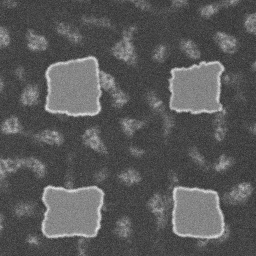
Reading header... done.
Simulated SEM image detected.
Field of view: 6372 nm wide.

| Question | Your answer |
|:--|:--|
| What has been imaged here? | raised bodies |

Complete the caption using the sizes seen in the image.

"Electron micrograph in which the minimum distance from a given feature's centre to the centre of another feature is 3070 nm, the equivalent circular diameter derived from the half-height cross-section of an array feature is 1.38 micrometres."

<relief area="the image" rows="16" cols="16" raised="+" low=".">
................
................
................
................
...+++.....+++..
...+++.....+++..
...+++.....+++..
................
................
................
................
................
...+++.....+++..
...+++.....+++..
...+++.....+++..
................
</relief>